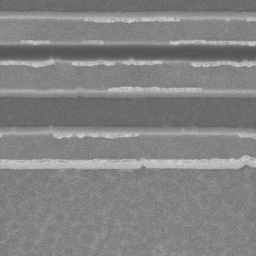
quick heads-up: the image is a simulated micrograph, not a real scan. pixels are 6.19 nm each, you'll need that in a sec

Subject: parallel lines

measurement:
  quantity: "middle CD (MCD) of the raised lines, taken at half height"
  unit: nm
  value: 218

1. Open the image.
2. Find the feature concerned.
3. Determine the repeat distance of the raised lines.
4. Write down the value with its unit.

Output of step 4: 362 nanometers